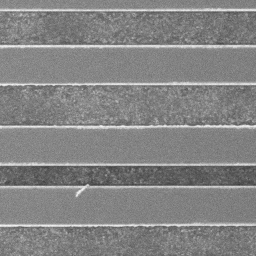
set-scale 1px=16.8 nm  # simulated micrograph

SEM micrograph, lines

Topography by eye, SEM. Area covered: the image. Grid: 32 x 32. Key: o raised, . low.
oooooooooooooooooooooooooooooooo
................................
................................
................................
................................
................................
oooooooooooooooooooooooooooooooo
oooooooooooooooooooooooooooooooo
oooooooooooooooooooooooooooooooo
oooooooooooooooooooooooooooooooo
oooooooooooooooooooooooooooooooo
................................
................................
................................
................................
................................
oooooooooooooooooooooooooooooooo
oooooooooooooooooooooooooooooooo
oooooooooooooooooooooooooooooooo
oooooooooooooooooooooooooooooooo
oooooooooooooooooooooooooooooooo
................................
................................
oooooooooooooooooooooooooooooooo
oooooooooooooooooooooooooooooooo
oooooooooooooooooooooooooooooooo
oooooooooooooooooooooooooooooooo
oooooooooooooooooooooooooooooooo
................................
................................
................................
................................